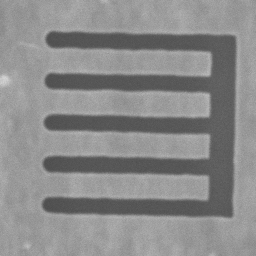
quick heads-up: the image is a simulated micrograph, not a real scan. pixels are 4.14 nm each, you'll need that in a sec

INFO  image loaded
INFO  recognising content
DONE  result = groups of lines, slits or small figures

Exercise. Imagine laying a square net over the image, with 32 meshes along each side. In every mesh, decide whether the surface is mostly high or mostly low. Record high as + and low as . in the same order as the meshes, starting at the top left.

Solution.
++++++++++++++++++++++++++++++++
++++++++++++++++++++++++++++++++
++++++++++++++++++++++++++++++++
++++++++++++++++++++++++++++++++
++++++.......................+++
++++++........................++
++++++++++++++++++++++++++....++
++++++++++++++++++++++++++....++
++++++++++++++++++++++++++....++
++++++...................+....++
++++++.......................+++
++++++++++++++++++++++.......+++
++++++++++++++++++++++++++...+++
++++++++++++++++++++++++++...+++
++++++...........+++++++++...+++
++++++.......................+++
+++++++++++++++..............+++
++++++++++++++++++++++++++...+++
++++++++++++++++++++++++++...+++
++++++........++++++++++++...+++
+++++........................+++
++++++.......................+++
++++++++++++++++++++++++++...+++
++++++++++++++++++++++++++...+++
++++++++++++++++++++++++++...+++
+++++........................+++
++++++.......................+++
++++++++++++++++++++++++++++++++
++++++++++++++++++++++++++++++++
++++++++++++++++++++++++++++++++
++++++++++++++++++++++++++++++++
++++++++++++++++++++++++++++++++